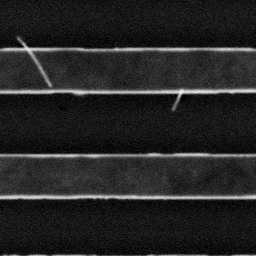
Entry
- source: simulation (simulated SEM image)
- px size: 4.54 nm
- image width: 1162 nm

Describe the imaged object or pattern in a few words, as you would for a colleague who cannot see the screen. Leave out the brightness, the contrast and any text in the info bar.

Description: lines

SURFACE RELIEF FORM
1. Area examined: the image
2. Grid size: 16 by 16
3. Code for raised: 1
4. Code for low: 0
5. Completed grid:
0000000000000000
0000000000000000
0000000000000000
1111111111111111
1111111111111111
1111111111111111
0000000000000000
0000000000000000
0000000000000000
0000000000000000
1111111111111111
1111111111111111
0000000000000000
0000000000000000
0000000000000000
0000000000000000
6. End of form